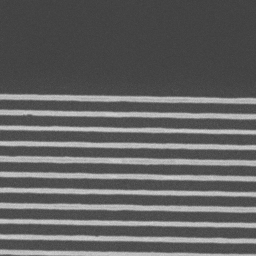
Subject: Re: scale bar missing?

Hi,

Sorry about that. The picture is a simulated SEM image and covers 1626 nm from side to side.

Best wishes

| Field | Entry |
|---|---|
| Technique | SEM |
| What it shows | parallel lines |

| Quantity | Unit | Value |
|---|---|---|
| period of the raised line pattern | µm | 0.0987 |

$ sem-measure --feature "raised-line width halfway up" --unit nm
27.8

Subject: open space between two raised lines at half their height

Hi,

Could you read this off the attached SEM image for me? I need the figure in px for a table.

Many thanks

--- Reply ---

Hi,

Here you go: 11.2